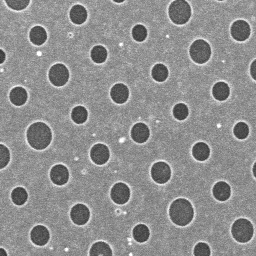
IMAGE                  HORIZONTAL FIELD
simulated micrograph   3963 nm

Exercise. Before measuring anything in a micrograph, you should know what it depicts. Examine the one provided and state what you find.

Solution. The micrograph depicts a regular array of holes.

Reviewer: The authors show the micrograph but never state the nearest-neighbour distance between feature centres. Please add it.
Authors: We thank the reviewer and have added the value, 0.688 microns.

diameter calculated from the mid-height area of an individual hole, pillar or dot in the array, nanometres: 307